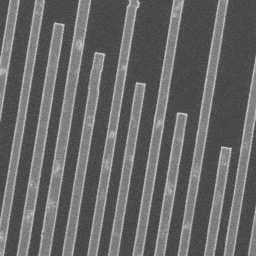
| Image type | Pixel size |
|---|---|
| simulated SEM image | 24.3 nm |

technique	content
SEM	parallel lines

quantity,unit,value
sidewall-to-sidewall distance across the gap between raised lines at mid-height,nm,326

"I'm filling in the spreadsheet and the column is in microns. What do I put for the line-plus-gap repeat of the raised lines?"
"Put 0.55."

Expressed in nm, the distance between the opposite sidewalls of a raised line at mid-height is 225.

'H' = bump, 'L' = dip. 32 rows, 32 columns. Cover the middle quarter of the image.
LHHHLLLHHHLLLLHHLLLLLLLLLHHLLLLL
LHHHLLLHHLLLLLHHLLLLLLLLLHHLLLLL
LHHHLLLHHLLLLHHLLLLLLLLLLHHLLLLL
LHHLLLLHHLLLLHHLLLLLLLLLHHHLLLLL
LHHLLLHHHLLLLHHLLLLLLLLLHHHLLLLL
HHHLLLHHHLLLLHHLLLHHLLLLHHLLLLLL
HHHLLLHHHLLLLHHLLLHHLLLLHHLLLLLL
HHHLLLHHHLLLLHHLLLHHLLLLHHLLLLLL
HHHLLLHHLLLLHHLLLHHHLLLLHHLLLLLL
HHLLLLHHLLLLHHLLLHHHLLLLHHLLLLLL
HHLLLLHHLLLLHHLLLHHLLLLHHHLLLLLL
HHLLLLHHLLLLHHLLLHHLLLLHHLLLLLLL
HHLLLHHHLLLLHHLLLHHLLLLHHLLLHHLL
HHLLLHHHLLLLHHLLLHHLLLLHHLLLHHHL
HHLLLHHLLLLHHLLLLHHLLLLHHLLLHHLL
HHLLLHHLLLLHHLLLHHHLLLHHHLLLHHLL
HLLLLHHLLLLHHLLLHHLLLLHHHLLLHHLL
HLLLLHHLLLLHHLLLHHLLLLHHLLLLHHLL
HLLLHHHLLLLHHLLLHHLLLLHHLLLHHHLL
HLLLHHHLLLLHHLLLHHLLLLHHLLLHHHLL
HLLLHHLLLLHHLLLLHHLLLLHHLLLHHHLL
HLLLHHLLLLHHLLLHHHLLLHHHLLLHHLLL
LLLLHHLLLLHHLLLHHLLLLHHHLLLHHLLL
LLLLHHLLLLHHLLLHHLLLLHHLLLLHHLLL
LLLHHHLLLLHHLLLHHLLLLHHLLLHHHLLL
LLLHHLLLLLHHLLLHHLLLLHHLLLHHHLLL
LLLHHLLLLHHHLLLHHLLLLHHLLLHHHLLL
LLLHHLLLLHHLLLHHHLLLLHHLLLHHLLLL
LLLHHLLLLHHLLLHHHLLLHHHLLLHHLLLL
LLLHHLLLLHHLLLHHLLLLHHHLLLHHLLLH
LLHHHLLLLHHLLLHHLLLLHHLLLHHHLLLH
LLHHHLLLHHHLLLHHLLLLHHLLLHHHLLLH